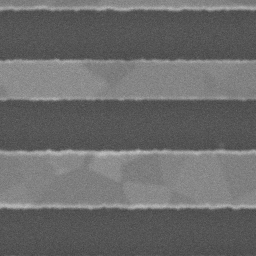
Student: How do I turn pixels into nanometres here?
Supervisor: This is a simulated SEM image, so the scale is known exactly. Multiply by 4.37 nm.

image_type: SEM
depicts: lines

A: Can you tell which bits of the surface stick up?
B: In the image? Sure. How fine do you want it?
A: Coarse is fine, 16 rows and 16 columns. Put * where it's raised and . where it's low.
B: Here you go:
****************
................
................
................
****************
****************
................
................
................
******..********
****************
****************
****************
................
................
................